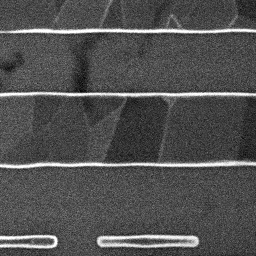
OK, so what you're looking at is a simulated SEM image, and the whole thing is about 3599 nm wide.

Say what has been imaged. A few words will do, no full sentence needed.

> wiring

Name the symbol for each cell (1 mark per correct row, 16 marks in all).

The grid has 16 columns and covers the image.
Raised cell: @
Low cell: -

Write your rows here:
@@@@@@@@@@@@@@@@
@@@@@@@@@@@@@@@@
----------------
----------------
----------------
----------------
@@@@@@@@@@@@@@@@
@@@@@@@@@@@@@@@@
@@@@@@@@@@@@@@@@
@@@@@@@@@@@@@@@@
----------------
----------------
----------------
----------------
----------------
----------------